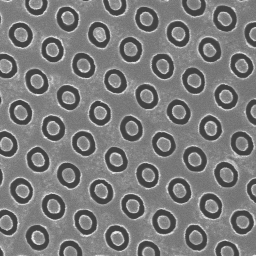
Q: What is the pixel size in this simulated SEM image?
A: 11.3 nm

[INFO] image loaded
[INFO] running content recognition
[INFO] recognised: a regular array of ring-shaped grooves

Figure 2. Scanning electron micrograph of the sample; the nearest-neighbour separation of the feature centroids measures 34.4 pixels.